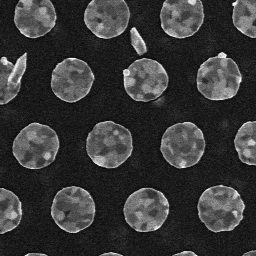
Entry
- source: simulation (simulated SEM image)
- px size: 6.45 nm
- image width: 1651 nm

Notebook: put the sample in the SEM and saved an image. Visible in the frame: a regular array of raised bodies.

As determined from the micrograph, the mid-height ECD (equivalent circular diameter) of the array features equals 290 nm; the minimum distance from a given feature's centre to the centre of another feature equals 473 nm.